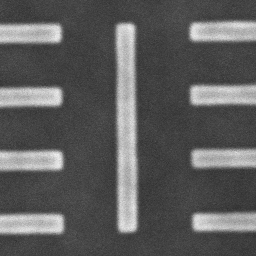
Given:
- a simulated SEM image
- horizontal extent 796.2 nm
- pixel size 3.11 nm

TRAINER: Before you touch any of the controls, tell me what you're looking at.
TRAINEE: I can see groups of lines, slits or small figures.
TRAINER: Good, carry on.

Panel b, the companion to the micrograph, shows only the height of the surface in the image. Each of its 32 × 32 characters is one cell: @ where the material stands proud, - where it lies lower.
--------------------------------
--------------------------------
--------------------------------
@@@@@@@--------@@-------@@@@@@@@
@@@@@@@--------@@-------@@@@@@@@
---------------@@---------------
---------------@@---------------
---------------@@---------------
---------------@@---------------
---------------@@---------------
---------------@@---------------
@@@@@@@--------@@-------@@@@@@@@
@@@@@@@--------@@-------@@@@@@@@
---------------@@---------------
---------------@@---------------
---------------@@---------------
---------------@@---------------
---------------@@---------------
---------------@@---------------
@@@@@@@@-------@@-------@@@@@@@@
@@@@@@@@-------@@-------@@@@@@@@
---------------@@---------------
---------------@@---------------
---------------@@---------------
---------------@@---------------
---------------@@---------------
---------------@@---------------
@@@@@@@@-------@@-------@@@@@@@@
@@@@@@@@-------@@--------@@@@@@@
--------------------------------
--------------------------------
--------------------------------